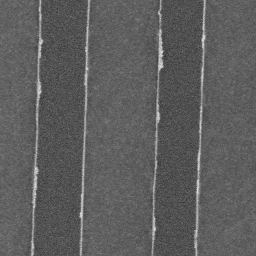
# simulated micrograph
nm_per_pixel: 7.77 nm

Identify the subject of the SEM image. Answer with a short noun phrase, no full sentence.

one or a few lines or trenches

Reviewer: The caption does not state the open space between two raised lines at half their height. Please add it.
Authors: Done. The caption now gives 551 nanometres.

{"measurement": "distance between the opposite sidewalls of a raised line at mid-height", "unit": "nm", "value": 365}